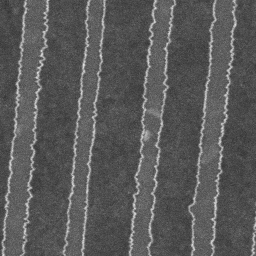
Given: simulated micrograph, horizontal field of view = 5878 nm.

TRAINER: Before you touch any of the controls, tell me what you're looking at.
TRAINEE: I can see one or a few lines or trenches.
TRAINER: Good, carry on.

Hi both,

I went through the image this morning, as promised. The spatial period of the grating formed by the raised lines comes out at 1430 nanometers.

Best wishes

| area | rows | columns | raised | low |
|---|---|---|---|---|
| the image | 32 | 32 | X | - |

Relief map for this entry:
XXX---XXXXX--XXXXXX---XXXXX--XXX
XXX---XXXXX--XXXXXX--XXXXXX--XXX
XXX---XXXXX--XXXXXX--XXXXXX--XXX
XXX---XXXXX--XXXXXX--XXXXX---XXX
XXX---XXXXX--XXXXXX--XXXXX---XXX
XXX---XXXXX--XXXXXX--XXXXX---XXX
XXX--XXXXXX--XXXXXX--XXXXX---XXX
XXX--XXXXXX--XXXXXX--XXXXX---XXX
XXX--XXXXXX--XXXXXX--XXXXX---XXX
XX---XXXXX--XXXXXX---XXXXX---XXX
XX---XXXXX--XXXXXX---XXXXX---XXX
XX---XXXXX--XXXXXX---XXXXX--XXXX
XX---XXXXX--XXXXXX---XXXXX--XXXX
XX---XXXXX--XXXXXX--XXXXXX--XXXX
XX--XXXXXX--XXXXXX--XXXXXX--XXXX
XX--XXXXXX--XXXXXX--XXXXX---XXXX
XX--XXXXXX--XXXXXX--XXXXX---XXXX
XX--XXXXXX--XXXXXX--XXXXX--XXXXX
XX--XXXXX--XXXXXXX--XXXXX---XXXX
X---XXXXX--XXXXXXX--XXXXX---XXXX
X---XXXXX--XXXXXXX--XXXXX--XXXXX
X---XXXXX--XXXXXX---XXXXX--XXXXX
X---XXXXX--XXXXXX--XXXXXX--XXXXX
X---XXXXX--XXXXXX--XXXXXX--XXXXX
X---XXXXX--XXXXXX--XXXXX---XXXXX
X--XXXXXX--XXXXXX--XXXXX---XXXXX
X--XXXXXX--XXXXXX--XXXXX---XXXXX
X--XXXXXX--XXXXXX--XXXXX---XXXXX
X--XXXXX---XXXXXX--XXXXX---XXXXX
X--XXXXX--XXXXXX---XXXXX---XXXXX
---XXXXX--XXXXXX---XXXXX---XXXXX
---XXXXX--XXXXXX---XXXXX---XXXXX